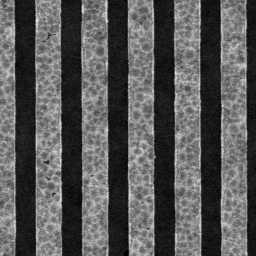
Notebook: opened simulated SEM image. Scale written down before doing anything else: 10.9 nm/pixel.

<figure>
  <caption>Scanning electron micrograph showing parallel lines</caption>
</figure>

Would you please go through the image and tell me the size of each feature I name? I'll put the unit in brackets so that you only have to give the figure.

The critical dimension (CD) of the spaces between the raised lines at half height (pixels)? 21.5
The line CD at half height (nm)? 267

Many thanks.